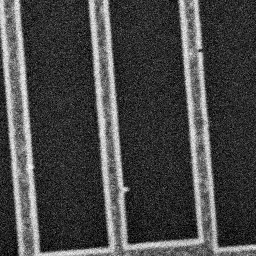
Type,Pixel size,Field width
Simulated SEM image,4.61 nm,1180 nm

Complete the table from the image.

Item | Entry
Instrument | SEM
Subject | one or a few lines or trenches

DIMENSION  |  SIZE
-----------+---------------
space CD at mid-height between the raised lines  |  0.344 um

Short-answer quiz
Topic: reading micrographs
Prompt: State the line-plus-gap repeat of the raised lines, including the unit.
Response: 412 nm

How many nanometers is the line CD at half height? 68.9